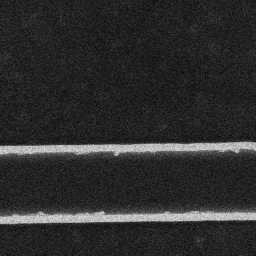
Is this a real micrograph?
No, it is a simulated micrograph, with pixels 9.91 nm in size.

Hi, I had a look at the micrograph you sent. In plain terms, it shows one or a few lines or trenches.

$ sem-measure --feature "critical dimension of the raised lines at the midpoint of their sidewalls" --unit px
71.1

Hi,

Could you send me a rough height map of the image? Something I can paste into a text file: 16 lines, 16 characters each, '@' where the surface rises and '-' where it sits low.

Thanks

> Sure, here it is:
----------------
----------------
----------------
----------------
----------------
----------------
----------------
----------------
----------------
@@@@@@@@@@@@@@@@
@@@@@@@@@@@@@@@@
@@@@@@@@@@@@@@@@
@@@@@@@@@@@@@@@@
@@@@@@@@@@@@@@@@
----------------
----------------